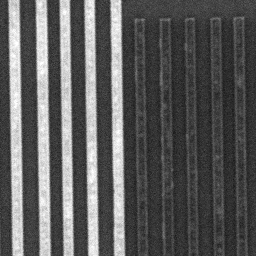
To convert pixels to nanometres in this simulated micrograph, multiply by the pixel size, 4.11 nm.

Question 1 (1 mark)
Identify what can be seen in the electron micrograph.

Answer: parallel lines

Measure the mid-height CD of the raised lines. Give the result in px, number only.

8.76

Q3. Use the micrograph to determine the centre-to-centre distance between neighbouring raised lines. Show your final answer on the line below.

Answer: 103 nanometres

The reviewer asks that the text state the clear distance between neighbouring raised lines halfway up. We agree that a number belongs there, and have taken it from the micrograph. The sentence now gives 67.8 nm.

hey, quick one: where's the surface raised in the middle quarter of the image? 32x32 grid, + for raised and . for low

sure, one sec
+.....++....++....++....+++....+
+.....++....++....++....+++....+
+.....++....++....++....+++....+
+.....++....++....++....+++....+
+.....++....++....++....+++....+
+.....++....++....++.....++....+
+.....++....++....++.....++....+
+.....++....++....++.....++....+
+.....++....++....++.....++....+
+.....++....++....++.....++....+
+.....++....++....++....+++....+
+.....++....++....++....+++....+
+.....++....++....++.....++....+
+.....++....++....++.....++....+
++....++....++....++.....++....+
++....++....++....++.....++....+
++....++....++....++.....++....+
++....++....++....++.....++....+
++....++....++....++.....++....+
++....++....++....++.....++....+
++....++.....+....++.....++....+
++....++.....+....++.....++....+
++....++.....+....++.....++....+
++....++.....++...++.....++....+
++....++.....++...++.....++....+
++....++.....++...++.....++....+
++....++.....++...++.....++....+
++....++.....++...++.....++....+
++....++.....++...++.....++....+
++....++.....++...++.....++....+
++....++.....++...++.....++....+
++....++.....++...++.....++....+